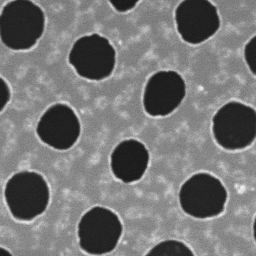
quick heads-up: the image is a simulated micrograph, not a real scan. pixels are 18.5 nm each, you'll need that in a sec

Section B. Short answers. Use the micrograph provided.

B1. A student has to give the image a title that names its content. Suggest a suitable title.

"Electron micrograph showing holes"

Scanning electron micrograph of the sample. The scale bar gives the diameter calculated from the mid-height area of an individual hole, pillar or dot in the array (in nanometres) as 860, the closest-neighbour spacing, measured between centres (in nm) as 1410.